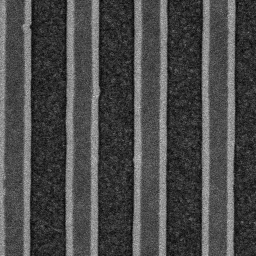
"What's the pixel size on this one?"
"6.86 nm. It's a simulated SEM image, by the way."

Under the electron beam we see one or a few lines or trenches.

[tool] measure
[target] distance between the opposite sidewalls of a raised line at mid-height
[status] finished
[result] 0.181 micrometres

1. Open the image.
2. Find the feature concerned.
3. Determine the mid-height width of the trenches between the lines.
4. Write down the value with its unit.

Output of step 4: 284 nm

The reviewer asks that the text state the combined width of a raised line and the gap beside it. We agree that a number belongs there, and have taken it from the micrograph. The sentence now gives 466 nm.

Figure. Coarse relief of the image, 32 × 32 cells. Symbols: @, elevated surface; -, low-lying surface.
@@@@-----@@@-----@@@------@@@---
@@@@-----@@@-----@@@------@@@---
@@@------@@@-----@@@------@@@---
@@@------@@@-----@@@------@@@---
@@@@-----@@@-----@@@------@@@---
@@@@-----@@@-----@@@------@@@---
@@@------@@@-----@@@------@@@---
@@@@-----@@@-----@@@------@@@---
@@@@-----@@@-----@@@------@@@---
@@@@-----@@@-----@@@------@@@---
@@@@-----@@@-----@@@------@@@---
@@@@-----@@@-----@@@------@@@---
@@@@-----@@@-----@@@------@@@---
@@@------@@@-----@@@------@@@---
@@@------@@@-----@@@------@@@---
@@@------@@@-----@@@------@@@---
@@@------@@@-----@@@------@@@---
@@@------@@@-----@@@------@@@---
@@@------@@@-----@@@------@@@---
@@@------@@@-----@@@------@@@---
@@@------@@@-----@@@------@@@---
@@@------@@@-----@@@------@@@---
@@@------@@@-----@@@------@@@---
@@@------@@@-----@@@------@@@---
@@@------@@@-----@@@------@@@---
@@@------@@@-----@@@------@@@---
@@@------@@@-----@@@------@@@---
@@@------@@@-----@@@------@@@---
@@@------@@@-----@@@------@@@---
@@@------@@@-----@@@------@@@---
@@@------@@@-----@@@------@@@---
@@@------@@@-----@@@------@@@---